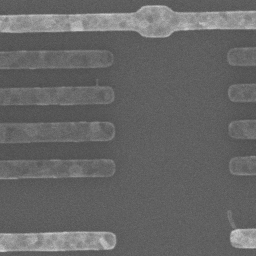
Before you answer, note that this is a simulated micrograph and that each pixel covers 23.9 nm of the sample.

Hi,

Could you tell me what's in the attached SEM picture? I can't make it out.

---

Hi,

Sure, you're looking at wiring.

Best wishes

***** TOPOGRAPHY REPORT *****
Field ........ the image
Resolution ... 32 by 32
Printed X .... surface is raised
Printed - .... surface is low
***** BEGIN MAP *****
--------------------------------
-----------------XXXXX----------
XXXXXXXXXXXXXXXXXXXXXXXXXXXXXXXX
XXXXXXXXXXXXXXXXXXXXXXXXXXXXXXXX
------------------XXX-----------
--------------------------------
-XXXXXXXXXXXXX---------------XXX
XXXXXXXXXXXXXX---------------XXX
--------------------------------
--------------------------------
--------------------------------
XXXXXXXXXXXXXX---------------XXX
XXXXXXXXXXXXXX---------------XXX
--------------------------------
--------------------------------
XXXXXXXXXXXXXX---------------XXX
XXXXXXXXXXXXXX---------------XXX
XXXXXXXXXXXX--------------------
--------------------------------
--------------------------------
XXXXXXXXXXXXXX---------------XXX
XXXXXXXXXXXXXX---------------XXX
--------------------------------
--------------------------------
--------------------------------
--------------------------------
--------------------------------
--------------------------------
--------------------------------
XXXXXXXXXXXXXX---------------XXX
XXXXXXXXXXXXXX---------------XXX
--------------------------------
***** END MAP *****